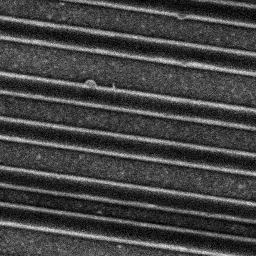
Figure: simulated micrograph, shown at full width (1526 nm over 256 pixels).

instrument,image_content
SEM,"parallel lines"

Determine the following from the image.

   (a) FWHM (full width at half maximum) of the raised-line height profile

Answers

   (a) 0.118 microns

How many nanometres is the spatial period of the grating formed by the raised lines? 276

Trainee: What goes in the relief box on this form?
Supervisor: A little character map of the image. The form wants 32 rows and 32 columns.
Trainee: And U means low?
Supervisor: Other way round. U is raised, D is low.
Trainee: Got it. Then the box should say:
DDDDDDDDDDDDUUUUUUUUUUUUUUUUUUDD
DDDDDDDDDDDDDDDDDDDUUUUUUUUUUUUU
UUUDDDDDDDDDDDDDDDDDDDDDDDUUUUUU
UUUUUUUUUDDDDDDDDDDDDDDDDDDDDDDD
UUUUUUUUUUUUUUUUDDDDDDDDDDDDDDDD
DDDDDUUUUUUUUUUUUUUUUUUDDDDDDDDD
DDDDDDDDDDDDUUUUUUUUUUUUUUUUUUDD
DDDDDDDDDDDDDDDDDDDUUUUUUUUUUUUU
DDDDDDDDDDDDDDDDDDDDDDDDDDUUUUUU
UUDDDDDDDDDDDDDDDDDDDDDDDDDDDDDD
UUUUUUUUUDUUDDDDDDDDDDDDDDDDDDDD
UUUUUUUUUUUUUUUUDDDDDDDDDDDDDDDD
DDDDDDDUUUUUUUUUUUUUUUUDDDDDDDDD
DDDDDDDDDDDDDDUUUUUUUUUUUUUUUUDD
DDDDDDDDDDDDDDDDDDDDUUUUUUUUUUUU
UUUUUDDDDDDDDDDDDDDDDDDDDDDUUUUU
UUUUUUUUUUUUDDDDDDDDDDDDDDDDDDDD
DDUUUUUUUUUUUUUUUUUDDDDDDDDDDDDD
DDDDDDDDDUUUUUUUUUUUUUUUUUDDDDDD
DDDDDDDDDDDDDDDDUUUUUUUUUUUUUUUU
DDDDDDDDDDDDDDDDDDDDDDDUUUUUUUUU
UUUUUDDDDDDDDDDDDDDDDDDDDDDDDDUU
UUUUUUUUUUUDDDDDDDDDDDDDDDDDDDDD
DDDUUUUUUUUUUUUUUUDDDDDDDDDDDDDD
DDDDDDDDDDUUUUUUUUUUUUUUUDDDDDDD
UDDDDDDDDDDDDDDDUUUUUUUUUUUUUUUU
UUUUUUUUDDDDDDDDDDDDDDDUUUUUUUUU
UUUUUUUUUUUUUUUDDDDDDDDDDDDDDDUU
DDDDUUUUUUUUUUUUUUUUUDDDDDDDDDDD
DDDDDDDDDDDUUUUUUUUUUUUUUUUUDDDD
DDDDDDDDDDDDDDDDDDUUUUUUUUUUUUUU
DDDDDDDDDDDDDDDDDDDDDDDDDUUUUUUU